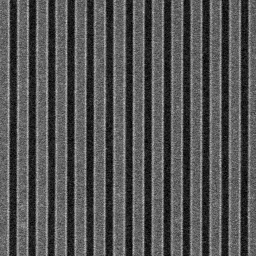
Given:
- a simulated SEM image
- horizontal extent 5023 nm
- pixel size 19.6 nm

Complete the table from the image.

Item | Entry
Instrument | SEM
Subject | parallel lines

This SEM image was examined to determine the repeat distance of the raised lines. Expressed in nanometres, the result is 378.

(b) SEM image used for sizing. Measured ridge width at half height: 0.216 um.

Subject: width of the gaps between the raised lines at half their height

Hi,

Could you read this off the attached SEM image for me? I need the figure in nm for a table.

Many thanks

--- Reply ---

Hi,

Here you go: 162